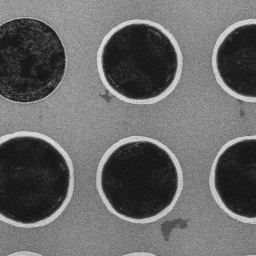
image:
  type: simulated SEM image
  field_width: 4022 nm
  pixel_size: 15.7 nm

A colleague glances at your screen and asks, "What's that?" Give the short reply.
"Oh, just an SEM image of raised bodies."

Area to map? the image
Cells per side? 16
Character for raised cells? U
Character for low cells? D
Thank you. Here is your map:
DDDDDDDDDDDDDDDD
DDDDDDDDUUDDDDDU
DDDDDDDUUUUDDDUU
DDDDDDUUUUUDDUUU
DDDDDDUUUUUDDDUU
DDDDDDDUUUUDDDUU
DDDDDDDDDDDDDDDD
DDDDDDDDDDDDDDDD
DUDDDDDDDDDDDDDD
UUUUDDDUUUUDDDUU
UUUUDDUUUUUDDUUU
UUUUDDUUUUUDDUUU
UUUUDDDUUUUDDDUU
UUUDDDDDUUDDDDDU
DDDDDDDDDDDDDDDD
DDDDDDDDDDDDDDDD